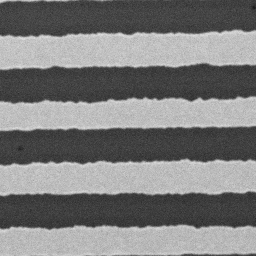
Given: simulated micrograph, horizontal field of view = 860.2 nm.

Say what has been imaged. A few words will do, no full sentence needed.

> lines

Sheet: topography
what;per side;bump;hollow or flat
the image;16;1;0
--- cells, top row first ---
0000000000000000
0000000000000000
1111111111111111
1111111111111111
0000000000000000
0000000000000000
1111111111111111
1111111111111111
0000000000000000
0000000000000000
1111111111111111
1111111111111111
0000000000000000
0000000000000000
1111111111111111
1111111111111111